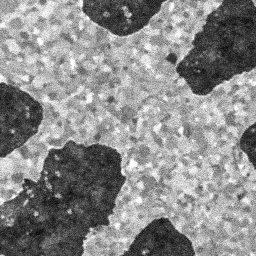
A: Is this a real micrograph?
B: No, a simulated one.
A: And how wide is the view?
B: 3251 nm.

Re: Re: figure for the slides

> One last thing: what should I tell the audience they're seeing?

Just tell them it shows holes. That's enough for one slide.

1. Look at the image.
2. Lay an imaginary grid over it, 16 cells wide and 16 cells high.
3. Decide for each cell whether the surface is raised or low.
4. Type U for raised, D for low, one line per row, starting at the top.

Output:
UUUUUDDDDDUUUDDD
UUUUUUDDDUUUUDDD
UUUUUUUUUUUUDDDD
UUUUUUUUUUUUDDDD
UUUUUUUUUUUDDDDU
DUUUUUUUUUUUDDUU
DDDUUUUUUUUUUUUU
DDDUUUUUUUUUUUUU
DDUUUUUUUUUUUUUD
DUUDDDDUUUUUUUUD
UUUDDDDDUUUUUUUU
UDDDDDDDUUUUUUUU
UDDDDDDUUUUUUUUU
DDDDDDDUUUUUUUUU
DDDDDDUUUDDUUUUU
DDDDDUUUDDDDUUUU